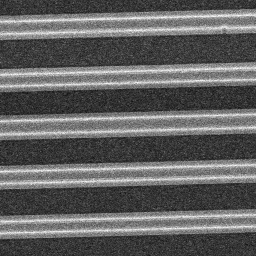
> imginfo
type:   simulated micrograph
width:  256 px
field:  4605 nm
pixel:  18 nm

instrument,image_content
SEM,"parallel lines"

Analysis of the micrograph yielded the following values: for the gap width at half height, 601 nanometers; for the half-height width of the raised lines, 288 nm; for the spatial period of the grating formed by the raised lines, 898 nanometres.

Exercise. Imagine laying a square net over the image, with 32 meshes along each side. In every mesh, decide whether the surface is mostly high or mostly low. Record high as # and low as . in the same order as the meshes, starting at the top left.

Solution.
................................
................................
################################
################################
................................
................................
................................
................................
........................########
################################
####################............
................................
................................
................................
................################
################################
#####################...........
................................
................................
................................
.............................###
################################
#########################.......
................................
................................
................................
................................
################################
################################
................................
................................
................................